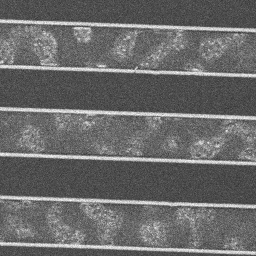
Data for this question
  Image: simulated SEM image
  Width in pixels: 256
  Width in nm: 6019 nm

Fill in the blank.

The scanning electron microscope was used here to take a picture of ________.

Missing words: one or a few lines or trenches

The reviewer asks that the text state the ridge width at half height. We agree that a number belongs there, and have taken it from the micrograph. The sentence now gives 993 nm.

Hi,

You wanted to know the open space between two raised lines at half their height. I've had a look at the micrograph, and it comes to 45.8 px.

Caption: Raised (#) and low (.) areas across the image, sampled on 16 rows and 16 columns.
################
.....###########
................
................
#########.......
################
################
................
................
................
################
################
.....###########
................
................
#######.........